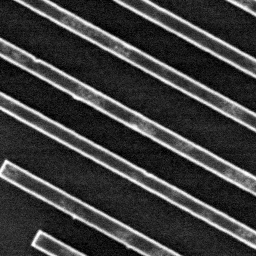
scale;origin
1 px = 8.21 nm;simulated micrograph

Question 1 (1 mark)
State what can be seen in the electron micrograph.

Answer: parallel lines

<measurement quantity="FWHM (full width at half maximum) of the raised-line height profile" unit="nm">123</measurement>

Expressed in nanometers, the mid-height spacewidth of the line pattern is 309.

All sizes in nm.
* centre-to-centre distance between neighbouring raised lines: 426